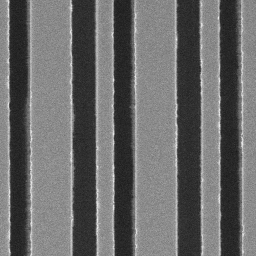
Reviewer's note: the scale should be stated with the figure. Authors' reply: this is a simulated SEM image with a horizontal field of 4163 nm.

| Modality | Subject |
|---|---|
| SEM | lines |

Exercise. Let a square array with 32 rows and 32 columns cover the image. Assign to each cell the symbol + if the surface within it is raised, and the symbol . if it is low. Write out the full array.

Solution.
+...+++++...++...+++++...++...++
+...+++++...++...+++++...++...++
+...+++++...++...+++++...++...++
+...+++++...++...+++++...++...++
+...+++++...++...+++++...++...++
+...+++++...++...+++++...++...++
+...+++++...++...+++++...++...++
+...+++++...++...+++++...++...++
+...+++++...++...+++++...++...++
+...+++++...++...+++++...++...++
+...+++++...++...+++++...++...++
+...+++++...++...+++++...++...++
+...+++++...++...+++++...++...++
+...+++++...++...+++++...++...++
+...+++++...++...+++++...++...++
+...+++++...++...+++++...++...++
+...+++++...++...+++++...++...++
+...+++++...++...+++++...++...++
+...+++++...++...+++++...++...++
+...+++++...++...+++++...++...++
+...+++++...++...+++++...++...++
+...+++++...++...+++++...++...++
+...+++++...++...+++++...++...++
+...+++++...++...+++++...++...++
+...+++++...++...+++++...++...++
+...+++++...++...+++++...++...++
+...+++++...++...+++++...+++..++
+...+++++...++...+++++...++...++
+...+++++...++...+++++...++...++
+...+++++...++...+++++...++...++
+...+++++...++...+++++...++...++
+...+++++...++...+++++...+++..++